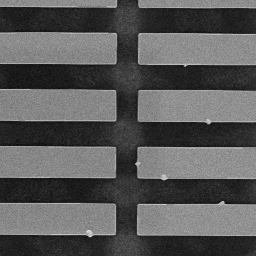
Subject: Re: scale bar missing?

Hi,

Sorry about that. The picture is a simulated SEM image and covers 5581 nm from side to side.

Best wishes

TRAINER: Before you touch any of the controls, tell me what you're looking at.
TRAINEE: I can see groups of lines, slits or small figures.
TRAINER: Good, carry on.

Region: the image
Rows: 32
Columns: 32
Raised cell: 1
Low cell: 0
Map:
11111111111111100111111111111111
00000000000000000000000000000000
00000000000000000000000000000000
00000000000000000000000000000000
11111111111111100111111111111111
11111111111111100111111111111111
11111111111111100111111111111111
11111111111111100111111111111111
00000000000000000000000000000000
00000000000000000000000000000000
00000000000000000000000000000000
11111111111111000111111111111111
11111111111111000111111111111111
11111111111111100111111111111111
11111111111111100111111111111111
00000000000000000000000000000000
00000000000000000000000000000000
00000000000000000000000000000000
11111111111111000111110000000000
11111111111111000111111111111111
11111111111111000111111111111111
11111111111111000111111111111111
00000000000000000000000000000000
00000000000000000000000000000000
00000000000000000000000000000000
11111111111111000000000000011000
11111111111111000111111111111111
11111111111111000111111111111111
11111111111111000111111111111111
00000000000000000000000000000000
00000000000000000000000000000000
00000000000000000000000000000000